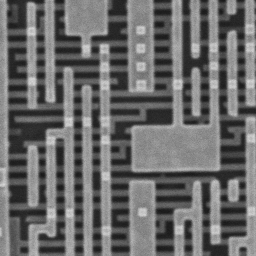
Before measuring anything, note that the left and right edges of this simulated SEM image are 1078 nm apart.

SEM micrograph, wiring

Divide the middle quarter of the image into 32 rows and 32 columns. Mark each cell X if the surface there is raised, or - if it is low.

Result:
---------XX-----XXXXXX-----XX---
XX-------XX-----XXXXXX-----XX---
XX-------XX-----XXXXXX------X---
XX-------XX-----XXXXXX------X---
XX-------XX-----XXXXXX-----XXX--
XX---X---XX-----XXXXXX-----XXX--
XX---XX--XX-----XXXXXX------X---
XX---XX--XX-----------------X---
XX---XX--XX-----------------XX--
XX---XX--XX-----------------XX--
XX---XX--XX-----------------XX--
XX---XX--XX-----------------XX--
XX---XX--XX-----------------XX--
XX---XX--XX-----------------XX--
XX---XX--XX-----------------XX--
XX---XX--XX-------XXXXXXXXXXXXXX
XX---XX--XX------XXXXXXXXXXXXXXX
XX---XX--XX------XXXXXXXXXXXXXXX
XX---XX--XX------XXXXXXXXXXXXXXX
XX---XX--XX------XXXXXXXXXXXXXXX
XX---XX--XX------XXXXXXXXXXXXXXX
XX---XX--XX------XXXXXXXXXXXXXXX
XX---XX--XX------XXXXXXXXXXXXXXX
XX---XX--XX------XXXXXXXXXXXXXXX
XX---XX--XX------XXXXXXXXXXXXXXX
XX---XX--XX------XXXXXXXXXXXXXXX
XX---XX--XX------XXXXXXXXXXXXXXX
XX---XX--XX---------------------
XX---XX--XXX--------------------
XX---XX--XXX-----XXXXXX---------
XX---XX--XXX-----XXXXXX---------
XX---XX--XXX-----XXXXXX---------